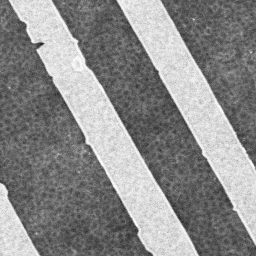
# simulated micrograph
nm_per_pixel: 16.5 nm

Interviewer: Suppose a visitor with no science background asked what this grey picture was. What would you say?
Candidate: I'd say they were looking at one or a few lines or trenches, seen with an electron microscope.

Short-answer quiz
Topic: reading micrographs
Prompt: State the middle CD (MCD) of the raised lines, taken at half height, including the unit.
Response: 35.7 px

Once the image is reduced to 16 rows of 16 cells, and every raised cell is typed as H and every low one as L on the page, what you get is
LHHLLLLLHHLLLLLL
LLHHLLLLHHHLLLLL
LLHHHLLLLHHLLLLL
LLLHHLLLLHHHLLLL
LLLHHHLLLLHHHLLL
LLLLHHLLLLHHHLLL
LLLLHHHLLLLHHHLL
LLLLLHHLLLLLHHLL
LLLLLHHHLLLLHHHL
LLLLLLHHHLLLLHHL
LLLLLLLHHLLLLHHH
LLLLLLLHHHLLLLHH
HLLLLLLLHHLLLLHH
HLLLLLLLHHHLLLLH
HHLLLLLLLHHHLLLL
HHLLLLLLLHHHLLLL